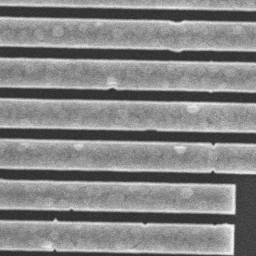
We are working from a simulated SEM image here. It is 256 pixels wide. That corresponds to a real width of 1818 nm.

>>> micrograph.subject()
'parallel lines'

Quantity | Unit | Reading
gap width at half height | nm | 83.4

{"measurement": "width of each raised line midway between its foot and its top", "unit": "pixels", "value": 29.2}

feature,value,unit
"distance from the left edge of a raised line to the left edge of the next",289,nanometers